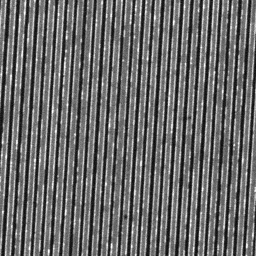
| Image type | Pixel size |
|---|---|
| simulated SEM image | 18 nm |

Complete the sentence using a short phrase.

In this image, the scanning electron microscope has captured parallel lines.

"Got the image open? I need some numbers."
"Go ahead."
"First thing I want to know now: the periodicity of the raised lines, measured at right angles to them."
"173 nanometers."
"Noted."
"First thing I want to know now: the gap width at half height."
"0.0808 microns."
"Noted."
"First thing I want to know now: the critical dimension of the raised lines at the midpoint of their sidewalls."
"0.0898 micrometres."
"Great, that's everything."